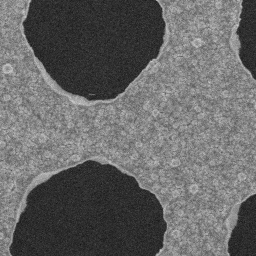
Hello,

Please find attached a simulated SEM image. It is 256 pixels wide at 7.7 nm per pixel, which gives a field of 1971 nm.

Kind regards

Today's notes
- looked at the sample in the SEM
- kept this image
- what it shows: holes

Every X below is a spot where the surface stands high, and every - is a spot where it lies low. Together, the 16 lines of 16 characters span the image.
XX--------XXXXX-
XX--------XXXXX-
XX--------XXXXX-
XX--------XXXXX-
XXX------XXXXXXX
XXXX----XXXXXXXX
XXXXXXXXXXXXXXXX
XXXXXXXXXXXXXXXX
XXXXXXXXXXXXXXXX
XXXXXXXXXXXXXXXX
XXXX---XXXXXXXXX
XX-------XXXXXXX
X---------XXXXX-
X---------XXXX--
X---------XXXX--
X---------XXXX--